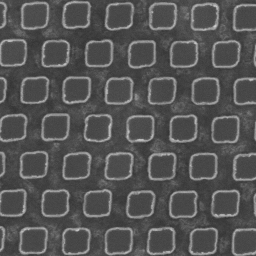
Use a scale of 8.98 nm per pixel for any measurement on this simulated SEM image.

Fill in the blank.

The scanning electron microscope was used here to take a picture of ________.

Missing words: a regular array of raised bodies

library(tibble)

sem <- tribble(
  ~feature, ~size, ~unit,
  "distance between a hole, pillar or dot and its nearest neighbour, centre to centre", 0.379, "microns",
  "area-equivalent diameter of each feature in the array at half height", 261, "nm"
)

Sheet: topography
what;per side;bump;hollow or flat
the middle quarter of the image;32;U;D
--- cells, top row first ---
DDDDDDUUDDDDDDDDDUUUUDDDDDDUUUUU
DDDDDDDDDDDDDDDDDDDDDDDDDDDDDDDD
DDDDDDDDDDDDDDDDDDDDDDDDDDDDDDDD
DDDDUUDDDDDDDDDDDDDDDDDDDDDDDDDD
UUUUUUUDDDDUUUUUUDDDDDUUUUUUDDDD
UUUUUUDDDDDUUUUUUDDDDUUUUUUUDDDD
UUUUUUDDDDDUUUUUUDDDDUUUUUUUDDDD
UUUUUUDDDDDUUUUUUDDDDUUUUUUUDDDD
UUUUUUDDDDDUUUUUUDDDDUUUUUUUDDDD
DUUDDDDDDDDUUUUUDDDDDUUUUUUDDDDD
DDDDDDDDDDDDDDDDDDDDDDDDDDDDDDDD
DDDDDDDDDDDDDDDDDDDDDDDDDDDDDDDD
DDDDDDDDDDDDDDDDDDDDDDDDDDDDDDDD
UDDDDDUUUUUUDDDDUUUUUUDDDDDUUUUU
UDDDDDUUUUUUDDDDUUUUUUDDDDDUUUUU
UDDDDUUUUUUUDDDDUUUUUUDDDDDUUUUU
UDDDDUUUUUUUDDDDUUUUUUDDDDDUUUUU
UDDDDUUUUUUDDDDDUUUUUUDDDDDUUUUU
DDDDDUUUUUUDDDDDUUUUUUDDDDDUUUUU
DDDDDDDDDDDDDDDDDDDDDDDDDDDDDDDD
DDDDDDDDDDDDDDDDDDDDDDDDDDDDDDDD
DDDDDDDDDDDDDDDDDDDDDDDDDDDDDDDD
DDUUUUDDDDDDUUUUUDDDDDUUDDDDDDDD
UUUUUUUDDDDUUUUUUDDDDUUUUUUUDDDD
UUUUUUDDDDDUUUUUUDDDDUUUUUUUDDDD
UUUUUUDDDDUUUUUUUDDDDUUUUUUUDDDD
UUUUUUDDDDUUUUUUUDDDDUUUUUUUDDDD
UUUUUUDDDDUUUUUUUDDDDUUUUUUDDDDU
UUUUUDDDDDDUUUUUDDDDDDUUUUUDDDDD
DDDDDDDDDDDDDDDDDDDDDDDDDDDDDDDD
DDDDDDDDDDDDDDDDDDDDDDDDDDDDDDDD
DDDDDDDDDUUDDDDDDDDDDDDDDDDDDDDD